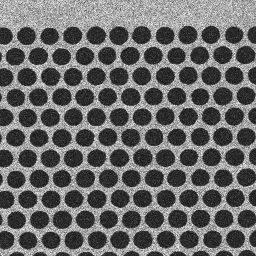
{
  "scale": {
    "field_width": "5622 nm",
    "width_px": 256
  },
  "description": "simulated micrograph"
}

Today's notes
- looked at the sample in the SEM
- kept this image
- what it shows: a regular array of holes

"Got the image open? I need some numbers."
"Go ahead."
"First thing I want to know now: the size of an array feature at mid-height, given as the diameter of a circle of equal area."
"406 nm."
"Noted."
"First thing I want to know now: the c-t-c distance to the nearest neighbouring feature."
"0.502 microns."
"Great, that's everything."